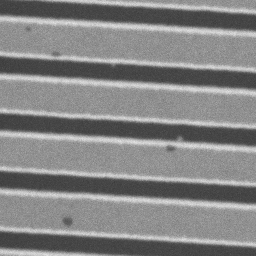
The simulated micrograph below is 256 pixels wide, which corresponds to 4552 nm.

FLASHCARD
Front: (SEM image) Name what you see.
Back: lines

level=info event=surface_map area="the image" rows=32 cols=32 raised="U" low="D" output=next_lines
DDDDDDDDDDDDUUUUUUUUUUUUUUUUUUUU
DDDDDDDDDDDDDDDDDDDDDDDDDDDDUUUU
UUUUUUUDDDDDDDDDDDDDDDDDDDDDDDDD
UUUUUUUUUUUUUUUUUUUUUUUUDDDDDDDD
UUUUUUUUUUUUUUUUUUUUUUUUUUUUUUUU
UUUUUUUUUUUUUUUUUUUUUUUUUUUUUUUU
UUUUUUUUUUUUUUUUUUUUUUUUUUUUUUUU
DDDDDDDDUUUUUUUUUUUUUUUUUUUUUUUU
DDDDDDDDDDDDDDDDDDDDDDDDUUUUUUUU
UUUUDDDDDDDDDDDDDDDDDDDDDDDDDDDD
UUUUUUUUUUUUUUUUUUUUDDDDDDDDDDDD
UUUUUUUUUUUUUUUUUUUUUUUUUUUUUUUU
UUUUUUUUUUUUUUUUUUUUUUUUUUUUUUUU
UUUUUUUUUUUUUUUUUUUUUUUUUUUUUUUU
DDDDDDUUUUUUUUUUUUUUUUUUUUUUUUUU
DDDDDDDDDDDDDDDDDDDDDDDUUUUUUUUU
UUDDDDDDDDDDDDDDDDDDDDDDDDDDDDDD
UUUUUUUUUUUUUUUUUUDDDDDDDDDDDDDD
UUUUUUUUUUUUUUUUUUUUUUUUUUUUUUUU
UUUUUUUUUUUUUUUUUUUUUUUUUUUUUUUU
UUUUUUUUUUUUUUUUUUUUUUUUUUUUUUUU
DDDUUUUUUUUUUUUUUUUUUUUUUUUUUUUU
DDDDDDDDDDDDDDDDDDDUUUUUUUUUUUUU
DDDDDDDDDDDDDDDDDDDDDDDDDDDDDDDD
UUUUUUUUUUUUUUUDDDDDDDDDDDDDDDDD
UUUUUUUUUUUUUUUUUUUUUUUUUUUUUUDD
UUUUUUUUUUUUUUUUUUUUUUUUUUUUUUUU
UUUUUUUUUUUUUUUUUUUUUUUUUUUUUUUU
UUUUUUUUUUUUUUUUUUUUUUUUUUUUUUUU
DDDDDDDDDDDDUUUUUUUUUUUUUUUUUUUU
DDDDDDDDDDDDDDDDDDDDDDDDDDDUUUUU
UUUUUUDDDDDDDDDDDDDDDDDDDDDDDDDD